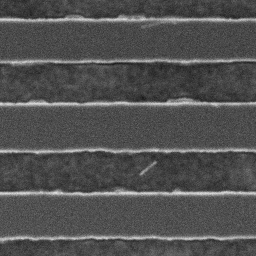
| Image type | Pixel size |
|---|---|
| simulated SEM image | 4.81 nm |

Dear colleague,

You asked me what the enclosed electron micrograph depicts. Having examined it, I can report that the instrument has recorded lines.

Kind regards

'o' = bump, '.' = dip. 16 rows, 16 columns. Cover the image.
................
oooooooooooooooo
oooooooooooooooo
oooooooooooooooo
................
................
oooooooooooooooo
oooooooooooooooo
oooooooooooooooo
..o....o........
................
................
oooooooooooooooo
oooooooooooooooo
oooooooooooooooo
................